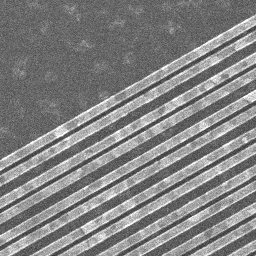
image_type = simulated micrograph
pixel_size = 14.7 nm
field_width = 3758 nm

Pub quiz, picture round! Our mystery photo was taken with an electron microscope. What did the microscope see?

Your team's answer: parallel lines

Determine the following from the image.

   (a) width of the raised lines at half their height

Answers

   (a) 8.26 px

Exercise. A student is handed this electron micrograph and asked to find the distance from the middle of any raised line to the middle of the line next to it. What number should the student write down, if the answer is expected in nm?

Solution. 236